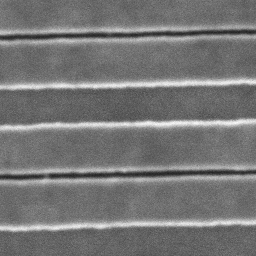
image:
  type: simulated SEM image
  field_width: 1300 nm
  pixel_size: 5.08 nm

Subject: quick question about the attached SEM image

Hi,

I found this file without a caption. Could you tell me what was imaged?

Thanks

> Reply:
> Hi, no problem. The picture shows lines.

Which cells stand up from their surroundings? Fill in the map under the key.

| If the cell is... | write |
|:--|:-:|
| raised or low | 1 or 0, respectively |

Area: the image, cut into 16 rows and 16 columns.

1111111111111111
1111111111111111
1111111111111111
1111111111111111
1111111111111111
1000000000000000
0000000000000000
0000000000000000
1111111111111111
1111111111111111
1111111111111111
1111111111111111
1111111111111111
1111111111111111
0000000000000000
0000000000000000